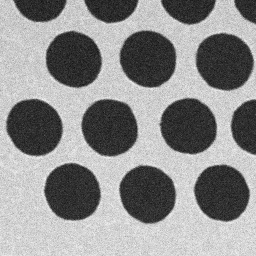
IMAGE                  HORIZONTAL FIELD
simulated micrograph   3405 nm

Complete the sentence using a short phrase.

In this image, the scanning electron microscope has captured a regular array of holes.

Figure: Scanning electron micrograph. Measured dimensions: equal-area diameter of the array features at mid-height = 764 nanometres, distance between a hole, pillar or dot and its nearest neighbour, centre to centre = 74.1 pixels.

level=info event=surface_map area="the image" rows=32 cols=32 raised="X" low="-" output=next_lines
XX------XXX------XXX-------XX---
XX------XXX------XXXX-----XXXX--
XXXX---XXXXX---XXXXXXX----XXXXX-
XXXXXXXXXXXXXXXXXXXXXXXXXXXXXXXX
XXXXXXX----XXXXX----XXXXXX---XXX
XXXXXX------XXX-------XXX------X
XXXXXX-------XX-------XXX-------
XXXXXX-------XX-------XX--------
XXXXXX-------XX-------XXX-------
XXXXXX------XXXX------XXX------X
XXXXXXXX---XXXXXX---XXXXXX-----X
XXXXXXXXXXXXXXXXXXXXXXXXXXXXXXXX
XXX--XXXXXXX--XXXXXXXX---XXXXXX-
XX-----XXXX-----XXXXX-----XXXX--
X------XXX-------XXX-------XX---
X-------XX-------XXX-------XX---
X-------XX-------XXX-------XX---
X-------XXX------XXX-------XX---
XX-----XXXX-----XXXXX-----XXXX--
XXXX-XXXXXXXX-XXXXXXXXXXXXXXXXXX
XXXXXXXX--XXXXXXXXXXXXXXXXXXXXXX
XXXXXX------XXXX-----XXXX-----XX
XXXXXX------XXX-------XXX------X
XXXXXX-------XX-------XX-------X
XXXXXX-------XX-------XX-------X
XXXXXX------XXX-------XXX------X
XXXXXXX-----XXXX-----XXXX-----XX
XXXXXXXX--XXXXXXX---XXXXXXX--XXX
XXXXXXXXXXXXXXXXXXXXXXXXXXXXXXXX
XXXXXXXXXXXXXXXXXXXXXXXXXXXXXXXX
XXXXXXXXXXXXXXXXXXXXXXXXXXXXXXXX
XXXXXXXXXXXXXXXXXXXXXXXXXXXXXXXX